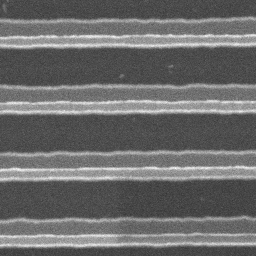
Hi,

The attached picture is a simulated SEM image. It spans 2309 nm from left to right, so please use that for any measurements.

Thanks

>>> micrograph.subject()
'lines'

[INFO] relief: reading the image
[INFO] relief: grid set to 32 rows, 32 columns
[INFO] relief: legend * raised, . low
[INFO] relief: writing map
................................
................................
.............................***
********************************
********************************
********************************
................................
................................
................................
................................
................................
********************************
********************************
********************************
................................
................................
................................
................................
................................
********************************
********************************
********************************
................................
................................
................................
................................
................................
..*.....**....******************
********************************
********************************
***********************.********
................................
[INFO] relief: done